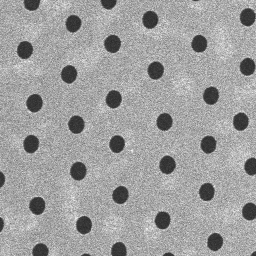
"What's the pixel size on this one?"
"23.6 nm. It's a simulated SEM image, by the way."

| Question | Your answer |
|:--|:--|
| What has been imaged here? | a regular array of holes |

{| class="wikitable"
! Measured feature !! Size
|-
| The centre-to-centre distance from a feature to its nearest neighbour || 1060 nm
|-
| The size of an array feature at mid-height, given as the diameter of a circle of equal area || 0.41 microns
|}